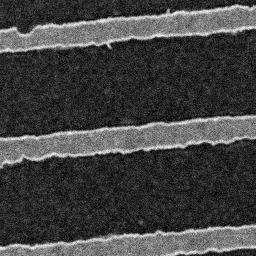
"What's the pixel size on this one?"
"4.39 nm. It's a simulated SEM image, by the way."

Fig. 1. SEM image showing one or a few lines or trenches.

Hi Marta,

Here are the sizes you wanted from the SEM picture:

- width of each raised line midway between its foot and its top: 22.4 pixels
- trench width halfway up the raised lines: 379 nm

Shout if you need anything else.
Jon